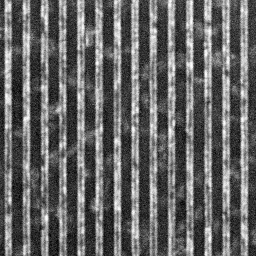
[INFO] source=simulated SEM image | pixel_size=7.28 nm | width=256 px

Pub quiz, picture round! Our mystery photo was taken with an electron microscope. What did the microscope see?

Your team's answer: parallel lines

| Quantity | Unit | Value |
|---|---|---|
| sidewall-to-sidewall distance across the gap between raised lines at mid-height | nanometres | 93.7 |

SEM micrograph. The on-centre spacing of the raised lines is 18.2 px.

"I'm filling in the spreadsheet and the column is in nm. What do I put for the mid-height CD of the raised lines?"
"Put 40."